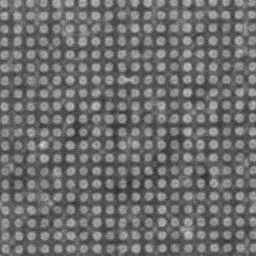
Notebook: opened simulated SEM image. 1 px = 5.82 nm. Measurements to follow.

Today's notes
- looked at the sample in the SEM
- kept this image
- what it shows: a regular array of raised bodies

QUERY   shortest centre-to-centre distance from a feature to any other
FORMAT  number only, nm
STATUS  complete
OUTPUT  72.8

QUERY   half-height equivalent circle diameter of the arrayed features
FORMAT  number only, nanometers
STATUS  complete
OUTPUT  43.1